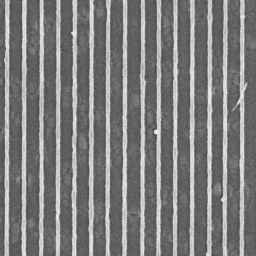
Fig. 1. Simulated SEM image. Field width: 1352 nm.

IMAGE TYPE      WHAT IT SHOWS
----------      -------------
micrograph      parallel lines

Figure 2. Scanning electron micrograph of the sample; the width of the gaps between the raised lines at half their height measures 72.6 nanometers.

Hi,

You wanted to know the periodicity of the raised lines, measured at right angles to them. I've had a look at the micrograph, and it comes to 88.6 nm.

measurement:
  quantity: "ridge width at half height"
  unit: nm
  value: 17.8